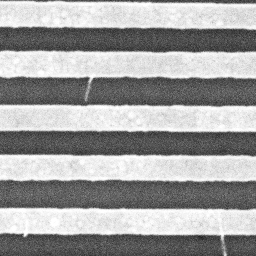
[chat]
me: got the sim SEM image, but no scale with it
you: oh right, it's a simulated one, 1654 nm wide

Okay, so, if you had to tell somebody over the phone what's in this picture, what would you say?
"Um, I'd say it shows lines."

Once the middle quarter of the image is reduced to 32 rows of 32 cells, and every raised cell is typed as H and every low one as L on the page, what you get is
HHHHHHHHHHHHHHHHHHHHHHHHHHHHHHHH
HHHHHHHHHHHHHHHHHHHHHHHHHHHHHHHH
HHHHHHHHHHHHHHHHHHHHHHHHHHHHHHHH
LLLLLLLLLLLLLLLLLLLLLLLLLLLLLLLL
LLLLLLLLLLLLLLLLLLLLLLLLLLLLLLLL
LLLLLLLLLLLLLLLLLLLLLLLLLLLLLLLL
LLLLLLLLLLLLLLLLLLLLLLLLLLLLLLLL
LLLLLLLLLLLLLLLLLLLLLLLLLLLLLLLL
LLLLLLLLLLLLLLLLLLLLLLLLLLLLLLLL
LLLLLLLLLLLLLLLLLLLLLLLLLLLLLLLL
LLLLLLLLLLLLLLLLLLLLLLLLLLLLLLLL
HHHHHHHHHHHHHHHHHHHHHHHHHHHHHHHH
HHHHHHHHHHHHHHHHHHHHHHHHHHHHHHHH
HHHHHHHHHHHHHHHHHHHHHHHHHHHHHHHH
HHHHHHHHHHHHHHHHHHHHHHHHHHHHHHHH
HHHHHHHHHHHHHHHHHHHHHHHHHHHHHHHH
LLHLLLLLLLLLLLLLHHLLHLLLLLHHHHHH
LLLLLLLLLLLLLLLLLLLLLLLLLLLLLLLL
LLLLLLLLLLLLLLLLLLLLLLLLLLLLLLLL
LLLLLLLLLLLLLLLLLLLLLLLLLLLLLLLL
LLLLLLLLLLLLLLLLLLLLLLLLLLLLLLLL
LLLLLLLLLLLLLLLLLLLLLLLLLLLLLLLL
LLLLLLLLLLLLLLLLLLLLLLLLLLLLLLLL
HHHHHHHHHHHHHHHHHHHHHHHHHHHHHHHH
HHHHHHHHHHHHHHHHHHHHHHHHHHHHHHHH
HHHHHHHHHHHHHHHHHHHHHHHHHHHHHHHH
HHHHHHHHHHHHHHHHHHHHHHHHHHHHHHHH
HHHHHHHHHHHHHHHHHHHHHHHHHHHHHHHH
HHHHHHHHHHHHHHHHHHHHHHHHHHHHHHHH
LLLLLLLLLLLLLLLLLLLLLLLLLLLLLLLL
LLLLLLLLLLLLLLLLLLLLLLLLLLLLLLLL
LLLLLLLLLLLLLLLLLLLLLLLLLLLLLLLL